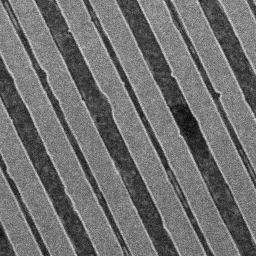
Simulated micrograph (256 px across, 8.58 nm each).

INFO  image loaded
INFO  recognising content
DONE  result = parallel lines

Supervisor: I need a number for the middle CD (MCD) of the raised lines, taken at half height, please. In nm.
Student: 194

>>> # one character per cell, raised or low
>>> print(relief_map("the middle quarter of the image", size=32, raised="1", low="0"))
10000011111100011111100000011111
10000001111110011111100000011111
10000001111110001111110000011111
11000000111111001111110000001111
11000000111111100111111000001111
11100000011111100111111000000111
11100000011111100011111100000111
11110000001111110011111100000011
11110000000111110001111110000011
11111000000111111001111110001001
11111000000011111001111111001001
11111100000011111100111111000000
11111100000011111100111111100000
11111110000001111110011111100000
01111110000001111110011111110000
01111111000001111111001111110000
00111111000000111111001111111000
00011111100000111111100111111000
10011111100000011111100111111100
10001111110000011111110011111100
11001111110000001111110011111110
11001111111000001111111001111110
11100111111000000111111001111111
11100111111100000111111100111111
11110011111100000011111100111111
11110011111110000011111110011111
11110001111110000001111110011111
11111001111111000001111111001111
11111000111111011000111111001111
11111100111111111000111111000111
11111110011111101000011111100111
11111110011111110000011111111011